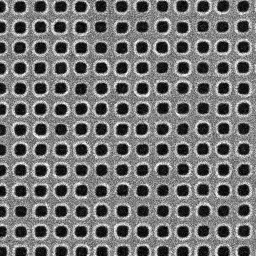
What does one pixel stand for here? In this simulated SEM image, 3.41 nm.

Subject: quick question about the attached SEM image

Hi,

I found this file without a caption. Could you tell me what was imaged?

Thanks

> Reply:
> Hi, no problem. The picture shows a regular array of holes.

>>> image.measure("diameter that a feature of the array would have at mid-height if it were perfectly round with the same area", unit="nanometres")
42.2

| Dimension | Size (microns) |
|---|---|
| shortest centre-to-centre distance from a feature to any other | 0.0676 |